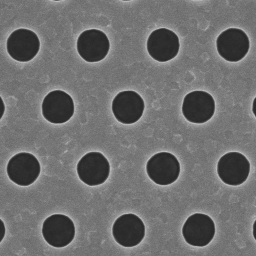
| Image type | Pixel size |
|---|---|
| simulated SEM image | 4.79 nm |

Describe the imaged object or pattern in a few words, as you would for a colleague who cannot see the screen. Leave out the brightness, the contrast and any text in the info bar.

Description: a regular array of holes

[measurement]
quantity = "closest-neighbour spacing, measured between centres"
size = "70.1 pixels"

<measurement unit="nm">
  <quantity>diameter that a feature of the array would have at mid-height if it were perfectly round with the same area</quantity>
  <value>155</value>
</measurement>